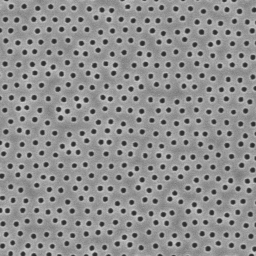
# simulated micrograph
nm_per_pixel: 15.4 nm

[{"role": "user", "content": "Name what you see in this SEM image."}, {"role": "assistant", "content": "a regular array of holes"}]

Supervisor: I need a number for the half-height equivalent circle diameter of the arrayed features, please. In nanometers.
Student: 83.4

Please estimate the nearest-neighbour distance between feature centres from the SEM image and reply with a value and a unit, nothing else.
0.163 micrometres